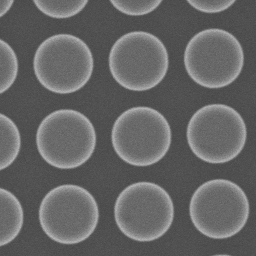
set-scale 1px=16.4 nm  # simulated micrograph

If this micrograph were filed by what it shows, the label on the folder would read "an array of small figures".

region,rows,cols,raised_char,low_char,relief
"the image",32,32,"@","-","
@---@@@@@@@---@@@@@@----@@@@@---
@----@@@@@-----@@@@-------@-----
--------------------------------
--------------------------------
-------@@------@@@@-----@@@@@---
@----@@@@@@---@@@@@@---@@@@@@@--
@@---@@@@@@---@@@@@@@--@@@@@@@--
@@--@@@@@@@@--@@@@@@@--@@@@@@@--
@@--@@@@@@@@--@@@@@@@--@@@@@@@--
@@---@@@@@@---@@@@@@@---@@@@@@--
@----@@@@@@----@@@@@-----@@@@---
-------@@-----------------------
--------------------------------
----------------@@@------@@@@---
@-----@@@@@----@@@@@----@@@@@@--
@@---@@@@@@---@@@@@@@---@@@@@@@-
@@---@@@@@@@--@@@@@@@--@@@@@@@@-
@@---@@@@@@@--@@@@@@@--@@@@@@@@-
@@---@@@@@@@--@@@@@@@---@@@@@@--
@@---@@@@@@----@@@@@-----@@@@---
@-----@@@@------@@@-------------
--------------------------------
---------------------------@----
-------@@@------@@@@-----@@@@@--
@@----@@@@@----@@@@@@---@@@@@@@-
@@@--@@@@@@@--@@@@@@@@--@@@@@@@-
@@@--@@@@@@@--@@@@@@@@--@@@@@@@-
@@@--@@@@@@@--@@@@@@@@--@@@@@@@-
@@@--@@@@@@@---@@@@@@----@@@@@--
@@----@@@@@-----@@@@------@@@---
@-------------------------------
--------------------------------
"